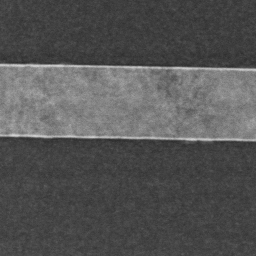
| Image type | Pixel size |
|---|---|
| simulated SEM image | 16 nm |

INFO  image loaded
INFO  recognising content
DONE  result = one or a few lines or trenches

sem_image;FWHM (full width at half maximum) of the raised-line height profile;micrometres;1.14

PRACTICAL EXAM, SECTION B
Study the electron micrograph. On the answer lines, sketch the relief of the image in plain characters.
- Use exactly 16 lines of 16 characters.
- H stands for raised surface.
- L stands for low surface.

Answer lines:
LLLLLLLLLLLLLLLL
LLLLLLLLLLLLLLLL
LLLLLLLLLLLLLLLL
LLLLLLLLLLLLLLLL
HHHHHHHHHHHHHHHH
HHHHHHHHHHHHHHHH
HHHHHHHHHHHHHHHH
HHHHHHHHHHHHHHHH
LLHHHHHHHHHHHHHH
LLLLLLLLLLLLLLLL
LLLLLLLLLLLLLLLL
LLLLLLLLLLLLLLLL
LLLLLLLLLLLLLLLL
LLLLLLLLLLLLLLLL
LLLLLLLLLLLLLLLL
LLLLLLLLLLLLLLLL